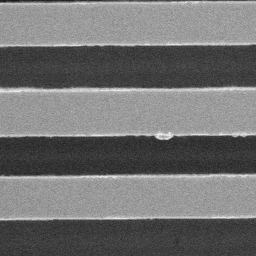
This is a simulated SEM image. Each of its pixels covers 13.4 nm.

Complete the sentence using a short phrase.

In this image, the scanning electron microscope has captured lines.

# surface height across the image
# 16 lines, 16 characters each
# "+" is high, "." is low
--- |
++++++++++++++++
++++++++++++++++
++++++++++++++++
................
................
................
++++++++++++++++
++++++++++++++++
+........++.....
................
................
++++++++++++++++
++++++++++++++++
++++++++++++++++
................
................